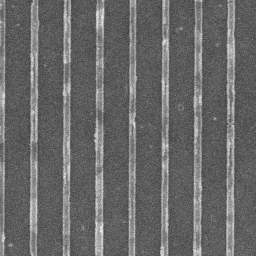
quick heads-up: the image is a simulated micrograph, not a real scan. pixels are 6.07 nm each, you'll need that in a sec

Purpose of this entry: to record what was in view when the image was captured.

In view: parallel lines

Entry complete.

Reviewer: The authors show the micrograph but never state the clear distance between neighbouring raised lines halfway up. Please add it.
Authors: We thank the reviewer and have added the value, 162 nm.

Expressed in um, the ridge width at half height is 0.0372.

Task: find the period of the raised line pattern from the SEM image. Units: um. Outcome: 0.199